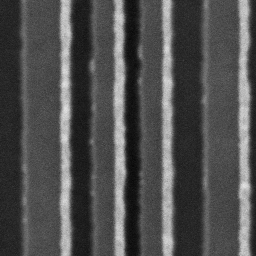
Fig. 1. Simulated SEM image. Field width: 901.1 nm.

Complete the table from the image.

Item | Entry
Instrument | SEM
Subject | lines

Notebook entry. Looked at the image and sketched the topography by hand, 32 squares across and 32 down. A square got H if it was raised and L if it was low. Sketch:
LLLHHHHHHLLLHHHLLLHHHLLLLLHHHHHL
LLLHHHHHHLLLHHHLLLHHHLLLLLHHHHHL
LLLHHHHHHLLLHHHLLLHHHLLLLLHHHHHL
LLLHHHHHHLLLHHHLLLHHHLLLLLHHHHHL
LLLHHHHHHLLLHHHLLLHHHLLLLLHHHHHL
LLLHHHHHHLLLHHHLLHHHHLLLLLHHHHHL
LLLHHHHHHLLLHHHLLHHHHLLLLLHHHHHL
LLLHHHHHHLLLHHHLLLHHHLLLLLHHHHHL
LLLHHHHHHLLHHHHHLLHHHLLLLLHHHHHL
LLLHHHHHHLLLHHHHLHHHHLLLLLHHHHHL
LLLHHHHHHLLLHHHHLHHHHLLLLLHHHHHL
LLLHHHHHHLLLHHHHLHHHHLLLLLHHHHHL
LLLHHHHHHLLLHHHHLLHHHLLLLHHHHHHL
LLLHHHHHHLLLHHHLLLHHHLLLLLHHHHHL
LLLHHHHHHLLLHHHLLLHHHLLLLLHHHHHL
LLLHHHHHHLLLHHHHLLHHHLLLLLHHHHHL
LLLHHHHHHLLLHHHHLLHHHLLLLLHHHHHL
LLLHHHHHHLLHHHHHLLHHHLLLLLHHHHHL
LLLHHHHHHLLLHHHHLLHHHLLLLLHHHHHL
LLLHHHHHHLLLHHHHLLHHHLLLLLHHHHHL
LLLHHHHHHLLLHHHHLLHHHLLLLLHHHHHL
LLLHHHHHHLLLHHHHLLHHHLLLLLHHHHHL
LLLHHHHHHLLLHHHHLLHHHLLLLHHHHHHL
LLLHHHHHHLLLHHHHLLHHHLLLLLHHHHHL
LLLHHHHHHLLLHHHLLLHHHLLLLLHHHHHL
LLLHHHHHHLLLHHHHLLHHHLLLLLHHHHHL
LLLHHHHHHLLLHHHHLLHHHLLLLLHHHHHL
LLLHHHHHHLLLHHHLLHHHHLLLLLHHHHHL
LLLHHHHHHLLLHHHLLHHHHLLLLLHHHHHL
LLLHHHHHHLLLHHHLLLHHHLLLLLHHHHHL
LLLHHHHHHLLLHHHHLLHHHHLLLLHHHHHL
LLLHHHHHHLLLHHHHLLHHHLLLLLHHHHHL